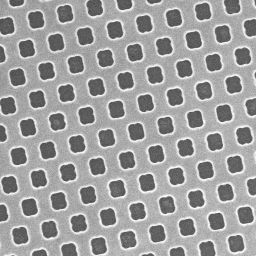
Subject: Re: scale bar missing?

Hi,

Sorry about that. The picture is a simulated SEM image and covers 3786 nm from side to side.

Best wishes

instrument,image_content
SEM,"a regular array of holes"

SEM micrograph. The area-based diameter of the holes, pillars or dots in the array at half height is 259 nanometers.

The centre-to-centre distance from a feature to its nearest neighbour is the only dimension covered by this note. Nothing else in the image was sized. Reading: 441 nm